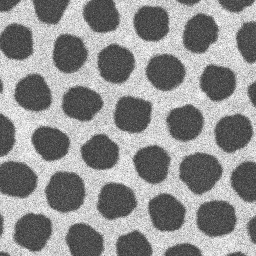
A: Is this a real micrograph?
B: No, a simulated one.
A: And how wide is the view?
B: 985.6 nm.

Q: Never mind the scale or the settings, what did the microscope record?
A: a regular array of holes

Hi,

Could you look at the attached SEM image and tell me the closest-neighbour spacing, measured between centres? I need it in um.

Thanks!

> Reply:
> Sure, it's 0.192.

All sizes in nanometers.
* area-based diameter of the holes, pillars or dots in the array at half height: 144